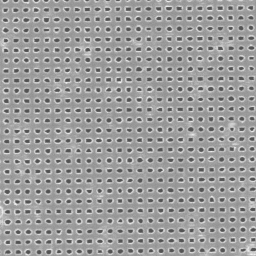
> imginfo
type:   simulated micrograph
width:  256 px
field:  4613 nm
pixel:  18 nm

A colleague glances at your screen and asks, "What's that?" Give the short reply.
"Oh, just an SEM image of a regular array of holes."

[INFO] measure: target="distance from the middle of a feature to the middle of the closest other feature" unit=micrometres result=0.177